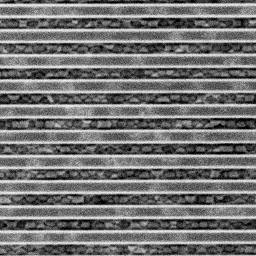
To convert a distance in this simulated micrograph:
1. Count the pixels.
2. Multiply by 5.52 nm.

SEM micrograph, parallel lines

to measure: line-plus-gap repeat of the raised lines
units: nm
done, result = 139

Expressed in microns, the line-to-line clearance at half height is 0.0676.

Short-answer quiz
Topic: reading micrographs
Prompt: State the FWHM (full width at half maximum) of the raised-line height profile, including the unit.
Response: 73.1 nm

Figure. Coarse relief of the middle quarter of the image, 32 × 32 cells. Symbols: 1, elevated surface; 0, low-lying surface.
11111111111111111111111111111111
00000000000000000000000000000000
00000000000000000000000000000000
00000000000000000000000000000000
11111111111111111111111111111111
11111111111111111111111111111111
11111111111111111111111111111111
00000000000000000000000000000000
00000000000000000000000000000000
00000000000000000000000000000000
11111111111111111111111111111111
11111111111111111111111111111111
11111111111111111111111111111111
11111000000000000000000000000000
00000000000000000000000000000000
00000000000000000000000000000000
00000000000000000000000000000000
11111111111111111111111111111111
11111111111111111111111111111111
11111111111111111111111111111111
00000000000000000000000000000000
00000000000000000000000000000000
00000000000000000000000000000000
11111111111111111111111111111111
11111111111111111111111111111111
11111111111111111111111111111111
00000000000000000000000000000000
00000000000000000000000000000000
00000000000000000000000000000000
11111111111111111111111111111111
11111111111111111111111111111111
11111111111111111111111111111111